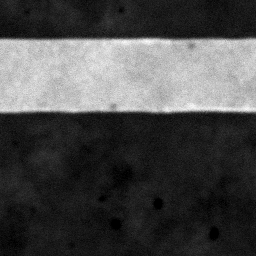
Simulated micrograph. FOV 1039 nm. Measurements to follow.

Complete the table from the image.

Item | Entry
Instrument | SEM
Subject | wiring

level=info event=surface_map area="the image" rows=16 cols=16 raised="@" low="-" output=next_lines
----------------
----------------
---------@-----@
@@@@@@@@@@@@@@@@
@@@@@@@@@@@@@@@@
@@@@@@@@@@@@@@@@
@@@@@@@@@@@@@@@@
----------------
----------------
----------------
----------------
----------------
----------------
----------------
----------------
----------------